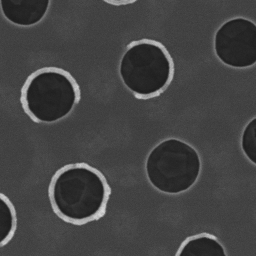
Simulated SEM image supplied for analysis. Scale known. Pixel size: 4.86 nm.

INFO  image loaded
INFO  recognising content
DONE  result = holes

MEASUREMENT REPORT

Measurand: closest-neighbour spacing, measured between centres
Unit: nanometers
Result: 478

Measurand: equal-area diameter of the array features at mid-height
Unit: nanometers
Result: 241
